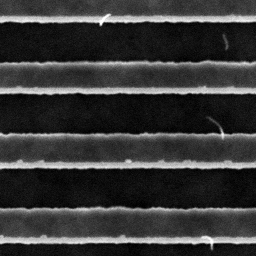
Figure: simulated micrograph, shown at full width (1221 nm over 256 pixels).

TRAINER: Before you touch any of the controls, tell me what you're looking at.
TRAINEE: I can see lines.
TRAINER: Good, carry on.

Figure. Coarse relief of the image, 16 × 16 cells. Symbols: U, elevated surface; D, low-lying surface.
UUUUUUUUUUUUUUUU
DDDDDDDDDDDDDDDD
DDDDDDDDDDDDDDDD
DDDDDDDDDDDDDDDD
UUUUUUUUUUUUUUUU
UUUUUUUUUUUUUUUU
DDDDDDDDDDDDDDDD
DDDDDDDDDDDDDDDD
UUUUUUUUUUUUUUUU
UUUUUUUUUUUUUUUU
DDDDDDDDDDDDDDDD
DDDDDDDDDDDDDDDD
DDDDDDDDDDDDDDDD
UUUUUUUUUUUUUUUU
UUUUUUUUUUUUUUUU
DDDDDDDDDDDDDDDD